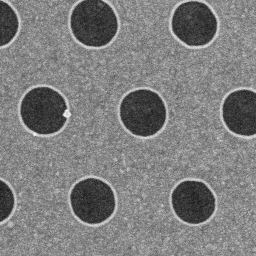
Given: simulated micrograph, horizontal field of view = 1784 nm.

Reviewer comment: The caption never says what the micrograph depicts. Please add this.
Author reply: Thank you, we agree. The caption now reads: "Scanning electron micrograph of holes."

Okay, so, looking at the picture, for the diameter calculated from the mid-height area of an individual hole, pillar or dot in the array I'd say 0.329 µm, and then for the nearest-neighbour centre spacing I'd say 697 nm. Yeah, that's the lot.